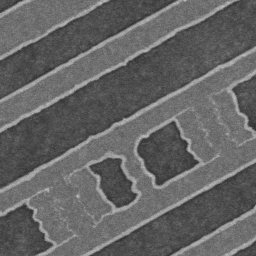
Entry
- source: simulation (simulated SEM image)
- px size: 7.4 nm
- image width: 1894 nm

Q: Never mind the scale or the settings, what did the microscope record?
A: one or a few lines or trenches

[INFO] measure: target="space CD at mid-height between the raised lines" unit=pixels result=49.7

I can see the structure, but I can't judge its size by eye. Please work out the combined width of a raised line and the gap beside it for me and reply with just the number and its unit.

73.3 pixels